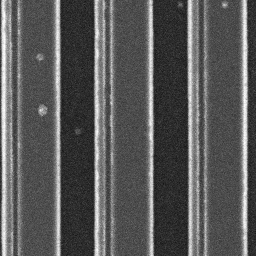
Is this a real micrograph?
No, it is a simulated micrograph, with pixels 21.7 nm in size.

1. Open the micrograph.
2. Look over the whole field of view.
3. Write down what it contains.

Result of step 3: lines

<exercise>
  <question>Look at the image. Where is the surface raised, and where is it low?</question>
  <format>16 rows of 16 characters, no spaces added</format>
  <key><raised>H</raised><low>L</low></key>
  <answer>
HHHHLLHHHLLLHHHL
HHHHLLHHHLLLHHHL
HHHHLLHHHLLLHHHL
HHHHLLHHHLLLHHHL
HHHHLLHHHLLLHHHL
HHHHLLHHHLLLHHHL
HHHHLLHHHLLLHHHL
HHHHLLHHHLLLHHHL
HHHHLLHHHLLLHHHL
HHHHLLHHHLLLHHHL
HHHHLLHHHLLLHHHL
HHHHLLHHHLLLHHHL
HHHHLLHHHLLLHHHL
HHHHLLHHHLLLHHHL
HHHHLLHHHLLLHHHL
HHHHLLHHHLLLHHHL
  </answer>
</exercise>